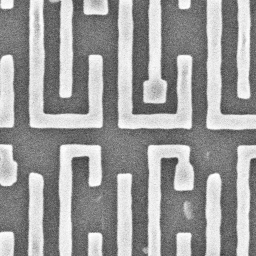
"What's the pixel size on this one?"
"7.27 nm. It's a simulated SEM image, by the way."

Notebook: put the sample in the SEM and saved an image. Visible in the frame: wiring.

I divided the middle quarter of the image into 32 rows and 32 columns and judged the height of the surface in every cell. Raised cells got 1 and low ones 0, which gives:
11000011100000111000011100000111
11000011100000111000011100000111
11000011100000111000011100000111
11000011100000111000011100000111
11000011100000111000111110000111
11000011100000111000111110001111
11000011100000111000111110001111
11000011100000111000111110000111
00000011100000111000111110000111
00000011100000111000001110000111
00000011100000111000000000000111
00000011100000111000000000001111
00000011100000111000000000001111
11111111100000111111111111111111
11111111100000111111111111111111
11111111100000111111111111111111
00000000000000000000000000000000
00000000000000000000000000000000
00000000000000000000000000000000
00000000000000000000000000000000
11111100000000000000001011111100
11111111100000000000011111111110
11111111100000000000011111111110
11000011100000000000011110000110
11000011100000000000011100000110
11000011100000000000011100001111
11000011100000000000001100001111
11000011100000000000001100001111
11000011100000111000011100001111
11000011100000111000011100001111
11000000000000111000011100001111
11000000000000111000011100000000